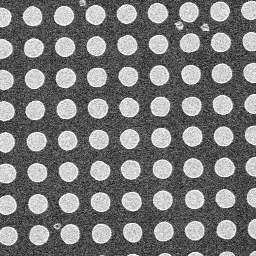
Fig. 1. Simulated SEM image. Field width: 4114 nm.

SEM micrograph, an array of small figures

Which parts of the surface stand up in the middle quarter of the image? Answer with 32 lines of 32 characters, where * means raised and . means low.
...............................*
**.....***....****....****....**
***...****....****....****....**
***...****....****....****....**
***...****....****....****....**
*......**.......................
................................
................................
.......................**......*
**.....***....****....****....**
***...*****...*****...****....**
***...*****...*****...****....**
***....***.....***....****.....*
**..............................
................................
................................
.......................***....**
**.....****...****....****....**
***...*****...*****...*****...**
***....****...****....*****...**
***....****....***.....***......
................................
................................
................................
........**.....***.....***.....*
***....****...*****...*****...**
***....****....****...*****...**
***....****....****....****...**
***.....***.....**......*.......
................................
................................
................................